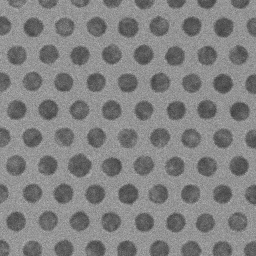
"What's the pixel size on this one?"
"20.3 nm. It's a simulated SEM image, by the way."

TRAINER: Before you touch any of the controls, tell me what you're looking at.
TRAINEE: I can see a regular array of holes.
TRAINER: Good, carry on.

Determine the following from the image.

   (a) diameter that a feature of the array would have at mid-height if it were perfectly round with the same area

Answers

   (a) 0.424 um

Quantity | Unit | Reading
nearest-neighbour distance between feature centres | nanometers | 637